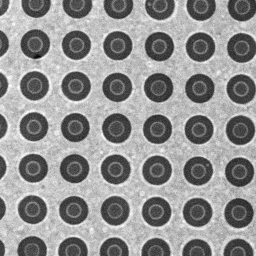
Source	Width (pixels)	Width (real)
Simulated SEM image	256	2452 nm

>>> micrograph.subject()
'an array of small figures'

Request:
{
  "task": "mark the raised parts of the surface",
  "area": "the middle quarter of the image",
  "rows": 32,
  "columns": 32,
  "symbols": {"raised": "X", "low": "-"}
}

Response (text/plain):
XXXXXXXXXXXXXXXXXXXXXXXXXXXXXXXX
XXXXXXXXXXXXXXXXXXXXXXXXXXXXXXXX
X----XXXXXXX---XXXXXXX---XXXXXXX
------XXXX------XXXXX-----XXXXX-
-------XXX-------XXX-------XXXX-
-------XX--------XXX-------XXX--
-------XX--------XXX-------XXX--
------XXXX-------XXX-------XXX--
------XXXXX-----XXXXX-----XXXXX-
XX--XXXXXXXXX--XXXXXXX---XXXXXXX
XXXXXXXXXXXXXXXXXXXXXXXXXXXXXXXX
XXXXXXXXXXXXXXXXXXXXXXXXXXXXXXXX
X----XXXXXXX---XXXXXXXX-XXXXXXXX
------XXXX------XXXXX-----XXXXX-
------XXXX-------XXX-------XXX--
-------XX--------XXX-------XXX--
-------XX--------XX--------XXX--
------XXXX-------XXX-------XXX--
-----XXXXX------XXXX------XXXXX-
XX--XXXXXXX----XXXXXX----XXXXXXX
XXXXXXXXXXXXXXXXXXXXXXXXXXXXXXXX
XXXXXXXXXXXXXXXXXXXXXXXXXXXXXXXX
XX--XXXXXXXX--XXXXXXXXX-XXXXXXXX
-----XXXXX------XXXXX-----XXXXXX
------XXX--------XXX-------XXXX-
-------XX--------XX--------XXX--
-------XX--------XX--------XXX--
------XXX--------XX--------XXX--
------XXXX-------XXX-------XXX--
X---XXXXXXX-----XXXX------XXXXX-
XXXXXXXXXXXXX-XXXXXXXX--XXXXXXXX
XXXXXXXXXXXXXXXXXXXXXXXXXXXXXXXX